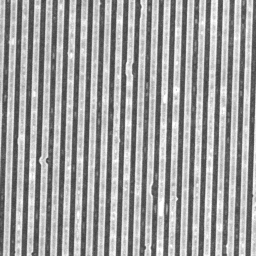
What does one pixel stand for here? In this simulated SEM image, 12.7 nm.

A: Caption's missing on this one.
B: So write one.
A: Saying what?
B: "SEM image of parallel lines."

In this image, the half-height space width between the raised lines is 77.6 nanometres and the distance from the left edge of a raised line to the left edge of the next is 150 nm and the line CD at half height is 0.0792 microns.